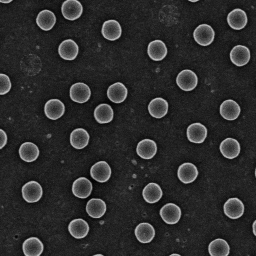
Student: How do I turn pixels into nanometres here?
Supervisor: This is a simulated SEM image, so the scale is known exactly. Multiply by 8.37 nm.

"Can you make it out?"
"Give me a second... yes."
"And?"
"a regular array of raised bodies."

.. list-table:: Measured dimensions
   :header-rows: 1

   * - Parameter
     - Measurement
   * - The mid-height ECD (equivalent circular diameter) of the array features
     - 166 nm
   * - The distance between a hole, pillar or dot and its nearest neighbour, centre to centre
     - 305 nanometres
